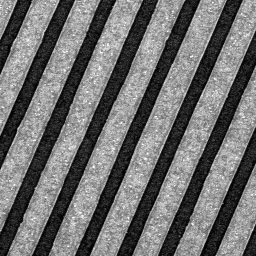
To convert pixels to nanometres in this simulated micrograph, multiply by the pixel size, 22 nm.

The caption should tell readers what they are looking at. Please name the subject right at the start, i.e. parallel lines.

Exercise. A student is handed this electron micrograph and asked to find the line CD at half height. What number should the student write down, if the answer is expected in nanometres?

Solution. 512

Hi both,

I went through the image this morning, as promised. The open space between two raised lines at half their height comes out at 320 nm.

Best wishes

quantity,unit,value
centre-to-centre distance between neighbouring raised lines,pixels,38.5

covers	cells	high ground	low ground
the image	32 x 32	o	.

oo..ooo..ooo..oooo..ooo..ooo..oo
o..oooo..ooo..ooo..ooo..oooo..oo
o..ooo..ooo..oooo..ooo..ooo..ooo
o..ooo..ooo..ooo..oooo..ooo..ooo
..ooo...ooo..ooo..ooo..ooo..oooo
..ooo..ooo..ooo...ooo..ooo..ooo.
.oooo..ooo..ooo..ooo..ooo...ooo.
.ooo..ooo..oooo..ooo..ooo..ooo..
oooo..ooo..ooo..ooo..oooo..ooo..
ooo..ooo..oooo..ooo..ooo..ooo..o
ooo..ooo..ooo..oooo.oooo..ooo..o
oo..oooo..ooo..ooo..ooo..oooo..o
oo..ooo..ooo...ooo..ooo..ooo..oo
oo..ooo..ooo..ooo..ooo..oooo..oo
o..ooo..oooo..ooo..ooo..ooo..ooo
o..ooo..ooo..ooo..oooo..ooo..ooo
..ooo...ooo..ooo..ooo..ooo..oooo
..ooo..ooo..ooo..oooo..ooo..ooo.
.oooo..ooo..ooo..ooo..oooo..ooo.
.ooo..ooo..oooo..ooo..ooo..ooo..
oooo..ooo..ooo..oooo.oooo..ooo..
ooo..oooo..ooo..ooo..ooo..oooo.o
ooo..ooo..ooo..oooo..ooo..ooo..o
oo..oooo..ooo..ooo..ooo..oooo..o
oo..ooo..ooo..oooo..ooo..ooo..oo
oo..ooo..ooo..ooo..ooo...ooo..oo
o..ooo..oooo..ooo..ooo..ooo..ooo
o..ooo..ooo..ooo..oooo..ooo..ooo
..ooo..oooo..ooo..ooo..ooo..oooo
..ooo..ooo..oooo..ooo..ooo..ooo.
..ooo..ooo..ooo..ooo..oooo..ooo.
.ooo..ooo..oooo..ooo..ooo..ooo..